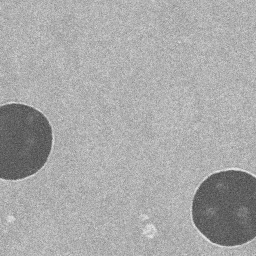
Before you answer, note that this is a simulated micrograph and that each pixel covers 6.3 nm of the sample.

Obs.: holes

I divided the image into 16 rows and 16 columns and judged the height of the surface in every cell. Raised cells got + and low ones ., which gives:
++++++++++++++++
++++++++++++++++
++++++++++++++++
++++++++++++++++
++++++++++++++++
++++++++++++++++
.+++++++++++++++
...+++++++++++++
...+++++++++++++
...+++++++++++++
...+++++++++++++
+++++++++++++...
++++++++++++....
++++++++++++....
+++++++++++++...
++++++++++++++++